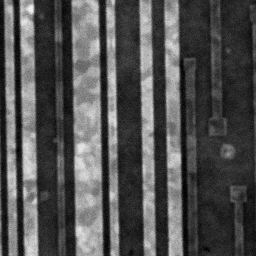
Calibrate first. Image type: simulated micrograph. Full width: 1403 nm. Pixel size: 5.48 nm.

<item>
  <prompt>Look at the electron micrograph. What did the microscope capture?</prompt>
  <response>groups of lines, slits or small figures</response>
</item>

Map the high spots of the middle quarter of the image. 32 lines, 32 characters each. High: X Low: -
--XXXXXXX--XX-------XX----XXX-XX
--XXXXXXX--XX-------XX----XXX-XX
--XXXXXXX--XX-------XX----XXX--X
---XXXXXX--XX-------XX----XXX--X
---XXXXXX--XX-------XX----XXX--X
---XXXXXX--XX-------XX----XXX--X
---XXXXXX--XX-------XX----XXX--X
---XXXXXX--XX-------XX----XXX--X
---XXXXXX--XX-------XX----XXX--X
---XXXXXX--XX-------XX----XXX--X
---XXXXXX--XX-------XX----XXX--X
---XXXXXX--XX-------XX----XXX--X
---XXXXXX--XX-------XX----XXX--X
---XXXXXX--XX-------XX----XXX--X
---XXXXXX--XX-------XX----XXX--X
---XXXXXX--XX-------XX----XXX--X
---XXXXXX--XX-------XX----XXX--X
---XXXXXX--XX-------XX----XXX--X
---XXXXXX--XX-------XX----XXX--X
---XXXXXX--XX-------XX----XXX--X
---XXXXXX--XX-------XX----XXX--X
---XXXXXX--XX-------XX----XXX--X
---XXXXXX--XX-------XX----XXX--X
---XXXXXX--XX-------XX----XXX--X
---XXXXXX--XX-------XX----XXX--X
---XXXXXX--XX-------XX----XXX--X
---XXXXXX--XX-------XX----XXX--X
---XXXXXX--XX-------XX----XXX--X
---XXXXXX--XX-------XX----XXX--X
---XXXXXX--XX-------XX----XXX--X
---XXXXXX--XX-------XX----XXX--X
---XXXXXX--XX-------XX----XXX--X